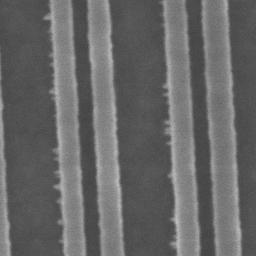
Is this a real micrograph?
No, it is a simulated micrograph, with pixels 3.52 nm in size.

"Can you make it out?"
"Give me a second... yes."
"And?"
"lines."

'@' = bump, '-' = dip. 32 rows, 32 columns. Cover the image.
------@@@--@@@------@@@--@@@----
------@@@--@@@-------@@--@@@----
------@@@--@@@-------@@--@@@@---
------@@@--@@@-------@@--@@@@---
-------@@--@@@-------@@--@@@@---
-------@@--@@@-------@@--@@@@---
-------@@--@@@-------@@@--@@@---
-------@@--@@@-------@@@--@@@---
-------@@--@@@-------@@@--@@@---
-------@@--@@@-------@@@--@@@---
-------@@@-@@@-------@@@--@@@---
-------@@@--@@-------@@@--@@@---
-------@@@--@@-------@@@--@@@---
-------@@@--@@-------@@@--@@@---
-------@@@--@@-------@@@--@@@---
-------@@@--@@@------@@@--@@@---
-------@@@--@@@------@@@--@@@---
-------@@@--@@@------@@@--@@@---
-------@@@--@@@------@@@--@@@---
-------@@@--@@@------@@@--@@@---
@------@@@--@@@-------@@--@@@---
@------@@@--@@@-------@@--@@@@--
@-------@@--@@@-------@@---@@@--
@-------@@--@@@-------@@@--@@@--
@-------@@--@@@-------@@@--@@@--
@-------@@--@@@-------@@@--@@@--
@-------@@--@@@-------@@@--@@@--
@-------@@--@@@-------@@@--@@@--
@-------@@---@@-------@@@--@@@--
@-------@@@--@@-------@@@--@@@--
@-------@@@--@@-------@@@--@@@--
@-------@@@--@@-------@@@--@@@--